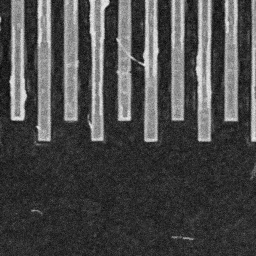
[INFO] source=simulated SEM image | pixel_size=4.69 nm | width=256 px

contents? parallel lines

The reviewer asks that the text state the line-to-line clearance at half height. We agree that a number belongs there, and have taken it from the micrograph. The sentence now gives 14.5 px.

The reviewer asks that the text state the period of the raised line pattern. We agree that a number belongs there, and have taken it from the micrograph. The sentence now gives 125 nm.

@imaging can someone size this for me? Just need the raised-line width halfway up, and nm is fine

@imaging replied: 54.5